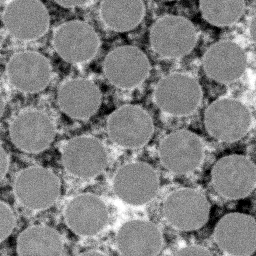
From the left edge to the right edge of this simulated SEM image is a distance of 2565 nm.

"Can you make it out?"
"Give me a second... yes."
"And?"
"a regular array of raised bodies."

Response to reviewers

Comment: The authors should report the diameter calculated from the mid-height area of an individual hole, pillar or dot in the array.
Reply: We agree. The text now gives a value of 0.45 micrometres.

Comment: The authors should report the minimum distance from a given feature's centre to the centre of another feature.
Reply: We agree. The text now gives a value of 0.559 µm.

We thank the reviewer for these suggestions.